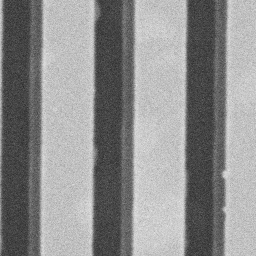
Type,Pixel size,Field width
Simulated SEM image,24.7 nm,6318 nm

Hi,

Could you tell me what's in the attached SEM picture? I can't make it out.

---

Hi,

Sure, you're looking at lines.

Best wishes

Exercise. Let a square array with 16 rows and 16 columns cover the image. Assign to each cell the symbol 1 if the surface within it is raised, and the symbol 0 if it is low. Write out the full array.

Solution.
0001110011110011
0001110011110011
0001110011110011
0001110011110011
0001110011110011
0001110011110011
0001110011110011
0001110011110011
0001110011110011
0001110011110011
0001110011110011
0001110011110011
0001110011110011
0001110011110011
0001110011110011
0001110011100011